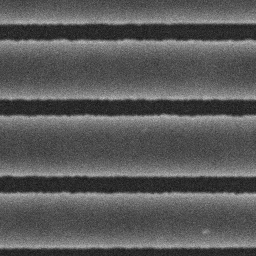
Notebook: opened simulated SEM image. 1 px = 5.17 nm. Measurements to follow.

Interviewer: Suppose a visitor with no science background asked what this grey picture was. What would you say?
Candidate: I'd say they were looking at lines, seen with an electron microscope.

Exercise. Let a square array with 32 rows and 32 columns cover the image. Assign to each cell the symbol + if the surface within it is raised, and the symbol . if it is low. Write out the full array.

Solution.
++++++++++++++++++++++++++++++++
++++++++++++++++++++++++++++++++
++++++++++++++++++++++++++++++++
................................
................................
++++++++++++++++++++++++++++++++
++++++++++++++++++++++++++++++++
++++++++++++++++++++++++++++++++
++++++++++++++++++++++++++++++++
++++++++++++++++++++++++++++++++
++++++++++++++++++++++++++++++++
++++++++++++++++++++++++++++++++
................................
................................
..........+........+++.....+....
++++++++++++++++++++++++++++++++
++++++++++++++++++++++++++++++++
++++++++++++++++++++++++++++++++
++++++++++++++++++++++++++++++++
++++++++++++++++++++++++++++++++
++++++++++++++++++++++++++++++++
++++++++++++++++++++++++++++++++
................................
................................
++++++++++++++++++++++++++++++++
++++++++++++++++++++++++++++++++
++++++++++++++++++++++++++++++++
++++++++++++++++++++++++++++++++
++++++++++++++++++++++++++++++++
++++++++++++++++++++++++++++++++
++++++++++++++++++++++++++++++++
................................